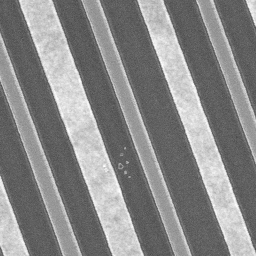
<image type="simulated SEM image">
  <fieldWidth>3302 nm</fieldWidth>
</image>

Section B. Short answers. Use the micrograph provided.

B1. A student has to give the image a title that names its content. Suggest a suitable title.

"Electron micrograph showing lines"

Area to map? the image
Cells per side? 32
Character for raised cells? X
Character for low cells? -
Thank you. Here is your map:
---XXXX---XXX----XXXX----XX----X
---XXXX----XX-----XXX----XX----X
---XXXX----XX-----XXX----XXX----
----XXXX---XXX----XXXX----XX----
----XXXX----XX-----XXX----XX----
X---XXXX----XX-----XXX-----XX---
X----XXXX----XX-----XXX----XX---
X----XXXX----XX-----XXX----XX---
XX----XXXX---XX-----XXX-----XX--
XX----XXXX----XX-----XXX----XX--
XX----XXXX----XX-----XXX----XX--
-XX----XXXX---XXX----XXXX----XX-
-XX----XXXX----XX-----XXX----XX-
-XX----XXXX----XX-----XXX----XX-
--XX----XXXX----XX-----XXX----XX
--XX----XXXX----XX-----XXX----XX
--XXX---XXXX----XX-----XXX-----X
---XX----XXXX----XX-----XXX----X
---XX----XXXX----XX-----XXX----X
----XX----XXX----XX-----XXXX----
----XX----XXXX----XX-----XXX----
----XX----XXXX----XX-----XXX----
-----XX----XXXX---XX-----XXXX---
X----XX----XXXX----XX-----XXX---
X----XX----XXXX----XX-----XXX---
X-----XX----XXXX----XX-----XXX--
XX----XX----XXXX----XX-----XXX--
XX----XXX---XXXX----XX-----XXX--
XX-----XX----XXXX----XX-----XXX-
XXX----XX----XXXX----XX-----XXX-
XXX----XXX----XXX----XX-----XXXX
XXX-----XX----XXXX----XX-----XXX